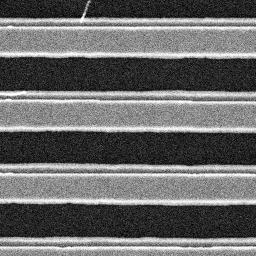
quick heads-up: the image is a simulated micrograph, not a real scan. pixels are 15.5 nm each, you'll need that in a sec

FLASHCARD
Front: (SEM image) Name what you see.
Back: lines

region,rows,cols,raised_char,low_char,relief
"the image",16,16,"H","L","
LLLLLLLLLLLLLLLL
HHHHHHHHHHHHHHHH
HHHHHHHHHHHHHHHH
LLLLLLLLLLLLLHLL
LLLLLLLLLLLLLLLL
LLLLLLLLLLLLLLLL
HHHHHHHHHHHHHHHH
HHHHHHHHHHHHHHHH
LLLLLLLLLLLLLLLL
LLLLLLLLLLLLLLLL
HHHHHHHHHHHHHHHL
HHHHHHHHHHHHHHHH
HHHHHHHHHHHHHHHH
LLLLLLLLLLLLLLLL
LLLLLLLLLLLLLLLL
HHHHHHHHHHHHHHHH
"